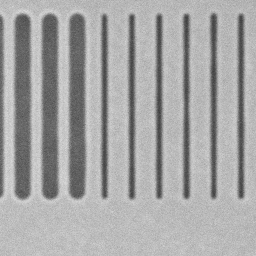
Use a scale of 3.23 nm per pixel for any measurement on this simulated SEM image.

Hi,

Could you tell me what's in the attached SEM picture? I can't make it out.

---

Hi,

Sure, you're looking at groups of lines, slits or small figures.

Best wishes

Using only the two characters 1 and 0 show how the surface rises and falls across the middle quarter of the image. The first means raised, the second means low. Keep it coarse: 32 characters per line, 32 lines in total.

10000111100111110011111001111100
10000111100111110011111001111100
10000111100111110011111001111100
10000111100111110011111001111100
10000111100111110011111001111100
10000111100111110011111001111100
10000111100111110011111001111100
10000111100111110011111001111100
10000111100111110011111001111100
10000111100111110011111001111100
10000111100111110011111001111101
10000111100111110011111001111101
10000111100111110011111001111101
10000111100111110011111001111100
10000111100111110011111001111100
10000111100111110011111001111100
10000111100111110011111001111100
10000111100111110011111001111100
10000111100111110011111001111100
10000111100111110011111001111100
10000011100111110011111001111100
10000011100111110011111001111100
10000011100111110011111001111100
10000011100111110011111001111100
10000011100111110011111001111100
10000011100111110011111001111100
10000011100111110011111001111100
10000111100111110011111001111100
10000111100111110011111001111100
10000111100111110011111001111100
10000111100111110011111001111100
10000111100111110011111001111100